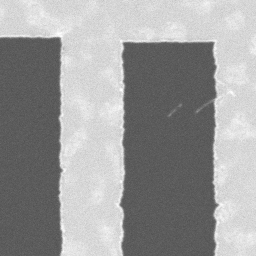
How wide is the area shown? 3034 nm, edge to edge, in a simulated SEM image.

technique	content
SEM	one or a few lines or trenches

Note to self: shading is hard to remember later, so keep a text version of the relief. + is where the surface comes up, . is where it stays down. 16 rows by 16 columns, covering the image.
................
................
++++............
++++....+++++...
++++....++++++..
++++....++++++..
++++....++++++..
++++....++++++..
++++....++++++..
++++....+++++...
++++....+++++...
++++....+++++...
++++...+++++++..
++++....++++++..
++++....++++++..
++++....++++++..